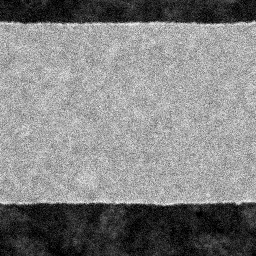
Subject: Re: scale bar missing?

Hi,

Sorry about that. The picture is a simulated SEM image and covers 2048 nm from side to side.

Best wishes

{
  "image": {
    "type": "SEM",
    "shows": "one or a few lines or trenches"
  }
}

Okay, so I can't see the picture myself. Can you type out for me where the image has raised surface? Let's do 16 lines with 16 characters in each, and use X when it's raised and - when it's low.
----------------
X-X---X-XXX---XX
XXXXXXXXXXXXXXXX
XXXXXXXXXXXXXXXX
XXXXXXXXXXXXXXXX
XXXXXXXXXXXXXXXX
XXXXXXXXXXXXXXXX
XXXXXXXXXXXXXXXX
XXXXXXXXXXXXXXXX
XXXXXXXXXXXXXXXX
XXXXXXXXXXXXXXXX
XXXXXXXXXXXXXXXX
XXXXXXXXXXXXXXXX
----------------
----------------
----------------